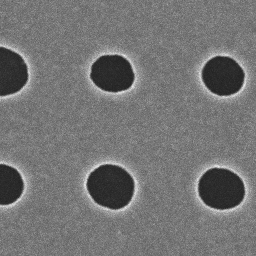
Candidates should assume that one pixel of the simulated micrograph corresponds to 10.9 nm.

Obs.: holes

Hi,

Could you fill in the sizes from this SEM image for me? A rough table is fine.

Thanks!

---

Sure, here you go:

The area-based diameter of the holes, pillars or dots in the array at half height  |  475 nanometers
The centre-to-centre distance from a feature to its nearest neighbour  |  1210 nanometres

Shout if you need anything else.